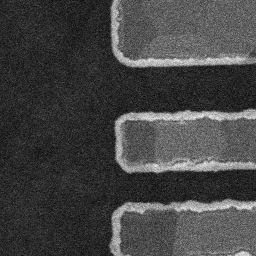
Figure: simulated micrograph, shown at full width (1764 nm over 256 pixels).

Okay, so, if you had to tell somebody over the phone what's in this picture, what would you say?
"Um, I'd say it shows one or a few lines or trenches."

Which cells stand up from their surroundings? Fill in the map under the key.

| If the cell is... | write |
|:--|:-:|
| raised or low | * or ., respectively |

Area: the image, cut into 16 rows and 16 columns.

.......*********
.......*********
.......*********
.......*********
................
................
................
........********
.......*********
.......*********
........*****...
................
................
.......*********
.......*********
.......*********